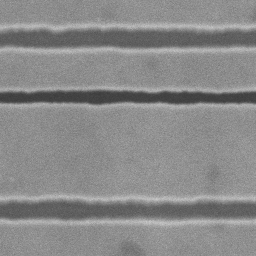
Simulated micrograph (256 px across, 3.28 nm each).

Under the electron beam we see lines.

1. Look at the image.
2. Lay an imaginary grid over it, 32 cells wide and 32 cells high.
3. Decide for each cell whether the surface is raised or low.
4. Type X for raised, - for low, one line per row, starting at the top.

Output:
XXXXXXXXXXXXXXXXXXXXXXXXXXXXXXXX
XXXXXXXXXXXXXXXXXXXXXXXXXXXXXXXX
XXXXXXXXXXXXXXXXXXXXXXXXXXXXXXXX
X-----XXX-------X-------XXXXX-X-
--------------------------------
--------------------------------
XXXXXXXXXXXXXXXXXXXXXXXXXXXXXXXX
XXXXXXXXXXXXXXXXXXXXXXXXXXXXXXXX
XXXXXXXXXXXXXXXXXXXXXXXXXXXXXXXX
XXXXXXXXXXXXXXXXXXXXXXXXXXXXXXXX
XXXXXXXXXXXXXXXXXXXXXXXXXXXXXXXX
---X--------------XX------XXX---
--------------------------------
XXXXXXXXXXXXXXXXXXXXXXXXXXXXXXXX
XXXXXXXXXXXXXXXXXXXXXXXXXXXXXXXX
XXXXXXXXXXXXXXXXXXXXXXXXXXXXXXXX
XXXXXXXXXXXXXXXXXXXXXXXXXXXXXXXX
XXXXXXXXXXXXXXXXXXXXXXXXXXXXXXXX
XXXXXXXXXXXXXXXXXXXXXXXXXXXXXXXX
XXXXXXXXXXXXXXXXXXXXXXXXXXXXXXXX
XXXXXXXXXXXXXXXXXXXXXXXXXXXXXXXX
XXXXXXXXXXXXXXXXXXXXXXXXXXXXXXXX
XXXXXXXXXXXXXXXXXXXXXXXXXXXXXXXX
XXXXXXXXXXXXXXXXXXXXXXXXXXXXXXXX
XXXXXXXXXXXXXXXXXXXXXXXXXXXXXXXX
--------------------------------
--------------------------------
--------------------------------
XXXXXXXXXXXXXXXXXXXXXXXXXXXXXXXX
XXXXXXXXXXXXXXXXXXXXXXXXXXXXXXXX
XXXXXXXXXXXXXXXXXXXXXXXXXXXXXXXX
XXXXXXXXXXXXXXXXXXXXXXXXXXXXXXXX